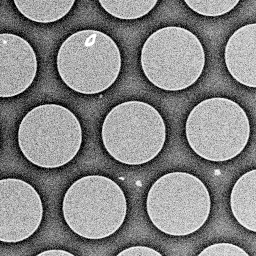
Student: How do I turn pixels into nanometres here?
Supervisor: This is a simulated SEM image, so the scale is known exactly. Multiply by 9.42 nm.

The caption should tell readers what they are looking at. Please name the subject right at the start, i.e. an array of small figures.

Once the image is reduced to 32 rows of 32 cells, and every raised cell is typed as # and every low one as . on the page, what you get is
..#######....######....#######..
...#####......####.......###....
....###.........................
.....................#........##
##.......####......#####.....###
####....######....#######...####
####...########...#######...####
####...########...#######...####
####...########...#######....###
####....#######...#######....###
####....######.....#####.......#
###.......##....................
..........................###...
.....###......#####.....######..
...######....#######....#######.
...#######...#######...########.
..########...########..########.
..########...########...#######.
...#######...#######....######..
...######.....#####......####...
.....###........................
...............................#
##........####......#####.....##
####.....######....#######...###
#####...#######....#######...###
#####...########..########...###
#####...########...#######...###
#####...#######....#######....##
#####....######.....#####......#
####......###...................
...........................#....
......##.......#####.....######.